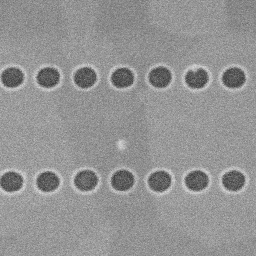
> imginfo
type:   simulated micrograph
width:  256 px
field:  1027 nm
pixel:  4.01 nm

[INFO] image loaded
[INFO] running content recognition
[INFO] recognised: a regular array of holes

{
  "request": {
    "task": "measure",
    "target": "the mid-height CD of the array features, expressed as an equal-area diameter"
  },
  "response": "97.8 nanometres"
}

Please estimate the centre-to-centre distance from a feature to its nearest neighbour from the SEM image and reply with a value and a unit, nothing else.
148 nanometers